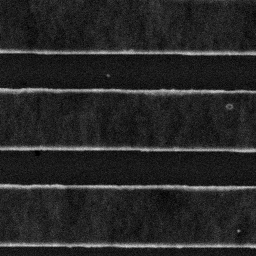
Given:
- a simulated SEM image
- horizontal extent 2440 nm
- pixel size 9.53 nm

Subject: lines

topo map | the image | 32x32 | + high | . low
++++++++++++++++++++++++++++++++
++++++++++++++++++++++++++++++++
++++++++++++++++++++++++++++++++
++++++++++++++++++++++++++++++++
++++++++++++++++++++++++++++++++
++++++++++++++++++++++++++++++++
++++++++++++++++++++++++++++++++
................................
................................
................................
................................
++++++++++++++++++++++++++++++++
++++++++++++++++++++++++++++++++
++++++++++++++++++++++++++++++++
++++++++++++++++++++++++++++++++
++++++++++++++++++++++++++++++++
++++++++++++++++++++++++++++++++
++++++++++++++++++++++++++++++++
++++++++++++++++++++++++++++++++
................................
................................
................................
................................
++++++++++++++++++++++++++++++++
++++++++++++++++++++++++++++++++
++++++++++++++++++++++++++++++++
++++++++++++++++++++++++++++++++
++++++++++++++++++++++++++++++++
++++++++++++++++++++++++++++++++
++++++++++++++++++++++++++++++++
++++++++++++++++++++++++++++++++
................................